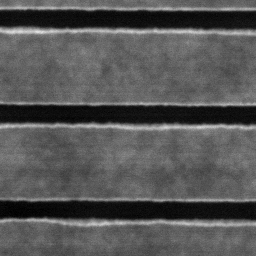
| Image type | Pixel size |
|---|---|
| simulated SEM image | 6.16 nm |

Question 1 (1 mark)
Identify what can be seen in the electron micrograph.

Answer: lines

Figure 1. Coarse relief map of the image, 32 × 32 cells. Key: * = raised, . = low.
********************************
................................
................................
................................
********************************
********************************
********************************
********************************
********************************
********************************
********************************
********************************
********************************
................................
................................
................................
********************************
********************************
********************************
********************************
********************************
********************************
********************************
********************************
********************************
................................
................................
******..........................
********************************
********************************
********************************
********************************